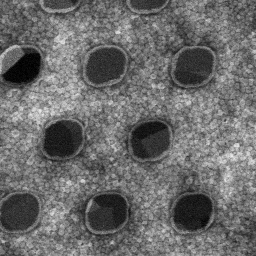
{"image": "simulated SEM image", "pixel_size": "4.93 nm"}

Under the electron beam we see raised bodies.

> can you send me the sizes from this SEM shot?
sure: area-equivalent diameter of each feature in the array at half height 213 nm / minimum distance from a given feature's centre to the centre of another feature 415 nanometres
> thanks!